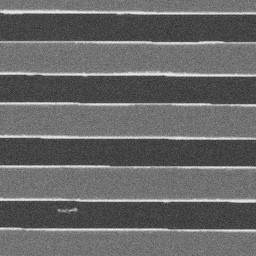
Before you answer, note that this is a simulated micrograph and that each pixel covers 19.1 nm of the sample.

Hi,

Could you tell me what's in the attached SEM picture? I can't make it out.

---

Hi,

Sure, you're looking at lines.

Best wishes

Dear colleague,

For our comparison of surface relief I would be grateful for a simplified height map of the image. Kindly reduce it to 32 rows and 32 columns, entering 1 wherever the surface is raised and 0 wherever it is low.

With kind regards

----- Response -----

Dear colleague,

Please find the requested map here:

11111111111111111111111111111111
11111111111111111111111111111111
00000000000000000000000000000000
00000000000000000000000000000000
00000000000000000000000000000000
11111111111111111111111111111111
11111111111111111111111111111111
11111111111111111111111111111111
11111111111111111111111111111111
00000000000000000000000000000000
00000000000000000000000000000000
00000000000000000000000000000000
00000000000000000000000000000000
11111111111111111111111111111111
11111111111111111111111111111111
11111111111111111111111111111111
11111111111111111111111111111111
00000000000000000000000000000000
00000000000000000000000000000000
00000000000000000000000000000000
00000000000000000000000000000000
11111111111111111111111111111111
11111111111111111111111111111111
11111111111111111111111111111111
11111111111111111111111111111111
00000000000000000000000000000000
00000000000000000000000000000000
00000000000000000000000000000000
00000000000000000000000000000000
11111111111111111111111111111111
11111111111111111111111111111111
11111111111111111111111111111111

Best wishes